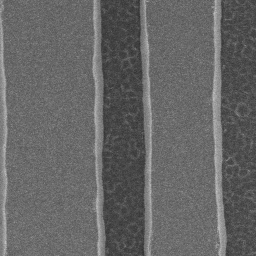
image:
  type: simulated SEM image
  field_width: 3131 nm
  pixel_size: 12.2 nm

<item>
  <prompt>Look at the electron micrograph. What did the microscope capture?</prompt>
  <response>one or a few lines or trenches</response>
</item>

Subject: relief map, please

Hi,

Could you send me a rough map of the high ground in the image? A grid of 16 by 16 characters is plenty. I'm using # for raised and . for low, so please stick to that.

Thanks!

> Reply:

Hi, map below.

######...#####..
######...#####..
######...#####..
######...#####..
######...#####..
######...#####..
######...#####..
######...#####..
######...#####..
######...#####..
######...#####..
######...#####..
######...#####..
######...#####..
######...#####..
######...#####..